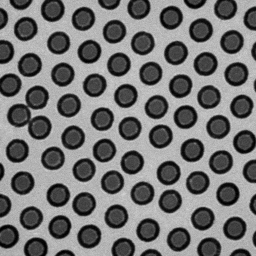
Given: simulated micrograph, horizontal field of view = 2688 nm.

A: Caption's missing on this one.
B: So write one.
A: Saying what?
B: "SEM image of a regular array of ring-shaped grooves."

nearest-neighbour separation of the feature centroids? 31.1 pixels